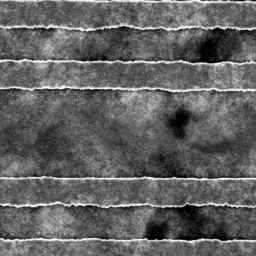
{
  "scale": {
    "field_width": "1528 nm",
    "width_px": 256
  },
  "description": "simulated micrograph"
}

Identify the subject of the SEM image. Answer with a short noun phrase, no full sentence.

lines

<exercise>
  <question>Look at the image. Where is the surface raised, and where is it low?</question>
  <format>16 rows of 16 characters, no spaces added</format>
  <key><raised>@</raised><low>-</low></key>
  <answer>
@@@@@@@@@@@@@@@@
@@@@@@@@@@@@@@@@
----------------
----------------
@@@@@@@@@@@@@@@@
@@@@@@@@@@@@@@@@
----------------
----------------
----------------
----------------
----------------
@@@@@@@@@@@@@@@@
@@@@@@@@@@@@@@@@
----------------
----------------
@@@@@@@@@@@@@@@@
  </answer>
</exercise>